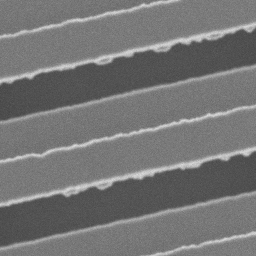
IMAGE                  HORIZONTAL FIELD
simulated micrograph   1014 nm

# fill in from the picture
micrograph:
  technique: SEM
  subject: lines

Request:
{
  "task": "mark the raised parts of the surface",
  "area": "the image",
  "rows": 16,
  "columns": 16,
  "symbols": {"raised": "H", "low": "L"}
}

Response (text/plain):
HHHHHHHHHHHHHHHH
HHHHHHHHHHHHHHHH
HHHHHHHHHHHHHLLL
HHHHHHHHLLLLLLLL
HHHLLLLLLLLLLLHH
LLLLLLLLLLHHHHHH
LLLLLHHHHHHHHHHH
LHHHHHHHHHHHHHHH
HHHHHHHHHHHHHHHH
HHHHHHHHHHHHHHHH
HHHHHHHHHHHHLLLL
HHHHHHHLLLLLLLLL
HHLLLLLLLLLLLLHH
LLLLLLLLLHHHHHHH
LLLLLHHHHHHHHHHH
HHHHHHHHHHHHHHHH